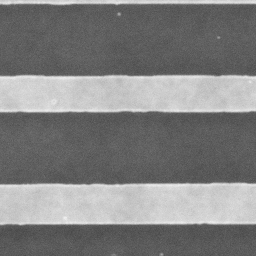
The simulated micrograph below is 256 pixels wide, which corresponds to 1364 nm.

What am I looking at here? lines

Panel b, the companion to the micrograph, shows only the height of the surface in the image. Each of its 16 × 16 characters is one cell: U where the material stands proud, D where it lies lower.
DDDDDDDDDDDDDDDD
DDDDDDDDDDDDDDDD
DDDDDDDDDDDDDDDD
DDDDDDDDDDDDDDDD
DDDDDDDDDDDDDDDD
UUUUUUUUUUUUUUUU
UUUUUUUUUUUUUUUU
DDDDDDDDDDDDDDDD
DDDDDDDDDDDDDDDD
DDDDDDDDDDDDDDDD
DDDDDDDDDDDDDDDD
DDDDDDDDDDDDDUUU
UUUUUUUUUUUUUUUU
UUUUUUUUUUUUUUUU
DDDDDDDDDDDDDDDD
DDDDDDDDDDDDDDDD